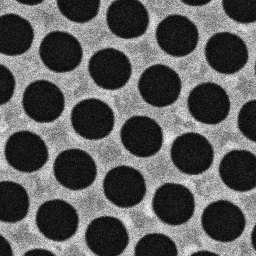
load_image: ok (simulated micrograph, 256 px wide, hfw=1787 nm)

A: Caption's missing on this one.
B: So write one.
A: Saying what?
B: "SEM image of a regular array of holes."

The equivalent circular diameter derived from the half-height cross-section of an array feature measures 302 nm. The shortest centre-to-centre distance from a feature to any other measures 364 nanometers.